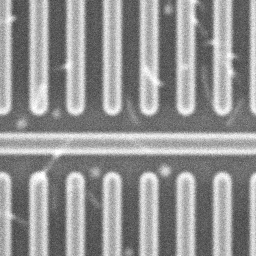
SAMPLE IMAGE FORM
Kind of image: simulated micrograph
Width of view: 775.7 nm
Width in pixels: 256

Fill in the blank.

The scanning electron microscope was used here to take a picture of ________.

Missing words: groups of lines, slits or small figures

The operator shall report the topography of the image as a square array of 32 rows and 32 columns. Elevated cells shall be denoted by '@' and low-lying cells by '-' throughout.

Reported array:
@---@@--@@---@@---@@--@@---@@--@
@---@@--@@---@@---@@--@@---@@--@
@---@@--@@---@@---@@--@@---@@--@
@---@@--@@---@@---@@--@@---@@--@
@---@@--@@---@@---@@--@@---@@--@
@---@@--@@---@@---@@--@@---@@--@
@---@@--@@---@@---@@--@@---@@--@
@---@@--@@---@@---@@--@@---@@--@
@---@@--@@---@@---@@--@@---@@--@
@---@@--@@---@@---@@--@@---@@--@
@---@@--@@---@@---@@--@@---@@--@
@---@@--@@---@@---@@--@@---@@--@
@---@@--@@---@@---@@--@@---@@--@
@---@@---@---@@---@@--@@---@@--@
--------------------------------
--------------------------------
--------------------------------
@@@@@@@@@@@@@@@@@@@@@@@@@@@@@@@@
@@@@@@@@@@@@@@@@@@@@@@@@@@@@@@@@
--------------------------------
--------------------------------
--------------------------------
@---@@--@@---@@---@@--@@---@@--@
@---@@--@@---@@---@@--@@---@@--@
@---@@--@@---@@---@@--@@---@@--@
@---@@--@@---@@---@@--@@---@@--@
@---@@--@@---@@---@@--@@---@@--@
@---@@--@@---@@---@@--@@---@@--@
@---@@--@@---@@---@@--@@---@@--@
@---@@--@@---@@---@@--@@---@@--@
@---@@--@@---@@---@@--@@---@@--@
@---@@--@@---@@---@@--@@---@@--@